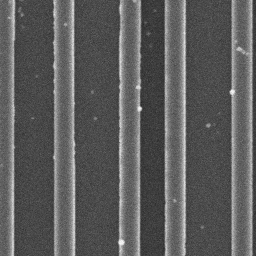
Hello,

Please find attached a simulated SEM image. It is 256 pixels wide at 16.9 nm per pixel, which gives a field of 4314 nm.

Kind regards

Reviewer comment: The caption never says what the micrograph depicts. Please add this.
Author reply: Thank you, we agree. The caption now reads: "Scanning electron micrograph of lines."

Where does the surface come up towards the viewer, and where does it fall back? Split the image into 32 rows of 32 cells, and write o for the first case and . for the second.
oo.....oo......ooo...oo......oo.
oo.....oo......oo....oo......oo.
oo.....oo......ooo...oo......oo.
oo.....oo......ooo...oo......oo.
oo.....oo......oo....oo......oo.
oo.....oo......oo....oo......oo.
oo.....oo......oo....oo......oo.
oo.....oo......oo....oo......oo.
oo.....oo......oo....oo......oo.
oo.....oo......oo....oo......oo.
oo.....oo......ooo...oo......oo.
oo.....oo......ooo...oo......oo.
oo.....oo......oo....oo......oo.
oo.....oo......ooo...oo......oo.
oo.....oo......oo....oo......oo.
oo.....oo......oo....oo......oo.
oo.....oo......oo....oo......oo.
oo.....oo......oo....oo......oo.
oo.....oo......oo....oo......oo.
oo.....oo......oo....oo......oo.
oo.....oo......oo....oo......oo.
oo.....oo......oo....oo......oo.
oo.....oo......oo....oo......oo.
oo.....oo......oo....oo......oo.
oo.....oo......oo....oo......oo.
oo.....oo......oo....oo......oo.
oo.....oo......oo....oo......oo.
oo.....oo......oo....oo......oo.
oo.....oo......oo....oo......oo.
oo.....oo......oo....oo......oo.
oo.....oo......oo....oo......oo.
oo.....oo......oo....oo......oo.